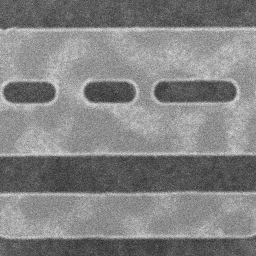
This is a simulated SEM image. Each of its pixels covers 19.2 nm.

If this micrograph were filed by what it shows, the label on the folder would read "one or a few lines or trenches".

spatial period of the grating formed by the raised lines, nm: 1530